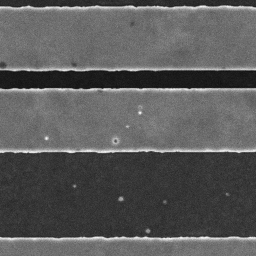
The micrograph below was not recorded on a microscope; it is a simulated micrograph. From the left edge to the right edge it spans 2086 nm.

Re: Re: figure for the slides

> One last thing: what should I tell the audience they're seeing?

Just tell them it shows lines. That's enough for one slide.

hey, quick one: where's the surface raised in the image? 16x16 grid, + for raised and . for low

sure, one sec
++++++++++++++++
++++++++++++++++
++++++++++++++++
++++++++++++++++
................
................
++++++++++++++++
++++++++++++++++
++++++++++++++++
+++.+.++..+.....
................
................
................
................
................
++++++++++++++++